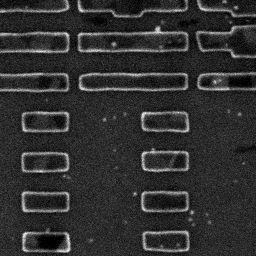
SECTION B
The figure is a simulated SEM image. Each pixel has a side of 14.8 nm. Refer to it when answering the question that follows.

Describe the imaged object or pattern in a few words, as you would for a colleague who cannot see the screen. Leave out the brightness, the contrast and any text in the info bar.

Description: wiring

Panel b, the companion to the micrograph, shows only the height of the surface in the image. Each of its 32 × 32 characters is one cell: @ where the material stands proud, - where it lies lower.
@@@@@@@@@-@@@@@@@@@@@@@--@@@@@@@
--------------@@@@-----------@@@
--------------------------------
-----------------------------@@@
@@@@@@@@--@@@@@@@@@@@@@--@@@@@@@
@@@@@@@@@-@@@@@@@@@@@@@--@@@@@@@
@----@@@---------------------@@@
--------------------------------
--------------------------------
@@@@@@@@--@@@@@@@@@@@@@--@@@@@@@
@@@@@@@@@-@@@@@@@@@@@@@--@@@@@@@
--------------------------------
--------------------------------
--------------------------------
---@@@@@@---------@@@@@---------
---@@@@@@---------@@@@@@--------
--------------------------------
--------------------------------
--------------------------------
---@@@@@----------@@@@@@--------
---@@@@@@---------@@@@@@--------
--------------------------------
--------------------------------
--------------------------------
---@@@@@@---------@@@@@@--------
---@@@@@@---------@@@@@@--------
--------------------------------
--------------------------------
--------------------------------
---@@@@@----------@@@@@@--------
---@@@@@@---------@@@@@@--------
--------------------------------